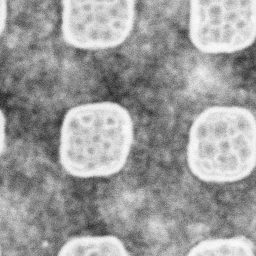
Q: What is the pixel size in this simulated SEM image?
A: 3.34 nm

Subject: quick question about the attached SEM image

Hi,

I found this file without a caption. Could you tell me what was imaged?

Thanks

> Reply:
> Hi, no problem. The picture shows raised bodies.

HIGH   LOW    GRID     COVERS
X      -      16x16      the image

----XXXX----XXXX
----XXXX----XXXX
----XXXX----XXXX
----------------
----------------
----------------
----------------
----XXXX----XXXX
----XXXX----XXXX
----XXXX----XXXX
----XXX-----XXXX
----------------
----------------
----------------
----------------
----XXXX----XXX-